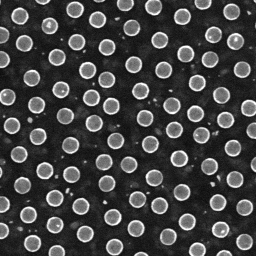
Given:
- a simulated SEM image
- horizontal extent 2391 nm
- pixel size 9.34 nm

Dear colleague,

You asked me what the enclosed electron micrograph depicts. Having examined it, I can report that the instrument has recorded a regular array of raised bodies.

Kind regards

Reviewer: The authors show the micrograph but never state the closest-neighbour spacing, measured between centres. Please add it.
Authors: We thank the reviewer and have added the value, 0.249 um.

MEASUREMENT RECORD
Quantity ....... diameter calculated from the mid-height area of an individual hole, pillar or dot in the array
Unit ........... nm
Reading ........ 152